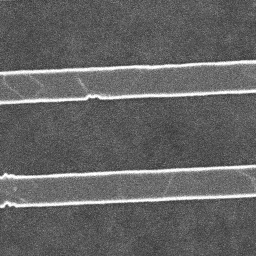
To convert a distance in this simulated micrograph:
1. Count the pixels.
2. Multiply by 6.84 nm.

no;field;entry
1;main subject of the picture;one or a few lines or trenches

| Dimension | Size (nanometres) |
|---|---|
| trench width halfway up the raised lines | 509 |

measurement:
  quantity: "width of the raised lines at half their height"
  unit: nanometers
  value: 202